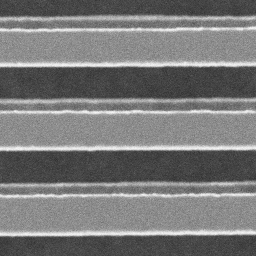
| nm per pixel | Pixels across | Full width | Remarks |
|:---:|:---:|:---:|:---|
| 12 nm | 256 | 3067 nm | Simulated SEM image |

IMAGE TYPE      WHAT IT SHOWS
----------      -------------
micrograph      lines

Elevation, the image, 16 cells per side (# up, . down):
................
################
################
################
................
................
################
################
################
................
................
.............###
################
################
################
................